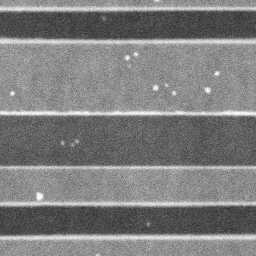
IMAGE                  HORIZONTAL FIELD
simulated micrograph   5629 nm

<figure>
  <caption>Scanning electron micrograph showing lines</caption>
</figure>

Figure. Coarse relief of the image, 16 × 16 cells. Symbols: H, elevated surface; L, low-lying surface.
HHHHHHHHHHHHHHHH
LLLLLLLLLLLLLLLL
LLLLLLLLLLLLLLLL
HHHHHHHHHHHHHHHH
HHHHHHHHHHHHHHHH
HHHHHHHHHHHHHHHH
HHHHHHHHHHHHHHHH
LLLLLLLLLLLLLLLL
LLLLLLLLLLLLLLLL
LLLLLLLLLLLLLLLL
HHHHHHHHHHHHHHHH
HHHHHHHHHHHHHHHH
HHHHHHHHHHHHHHHH
LLLLLLLLLLLLLLLL
LLLLLLLLLLLLLLLL
HHHHHHHHHHHHHHHH